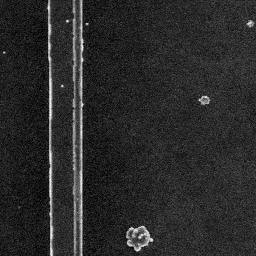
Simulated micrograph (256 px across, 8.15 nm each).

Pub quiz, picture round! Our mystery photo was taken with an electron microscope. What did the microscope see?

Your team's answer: lines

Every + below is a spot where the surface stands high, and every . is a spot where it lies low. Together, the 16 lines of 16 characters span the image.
...++...........
...++...........
...++...........
...++...........
...++...........
...++...........
...++...........
...++...........
...++...........
...++...........
...++...........
...++...........
...++...........
...++...........
...++...........
...++...........